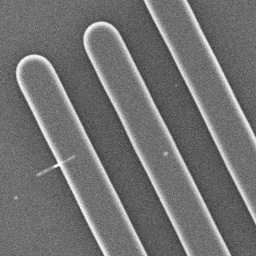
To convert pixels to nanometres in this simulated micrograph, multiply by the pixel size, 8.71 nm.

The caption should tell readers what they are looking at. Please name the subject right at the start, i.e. groups of lines, slits or small figures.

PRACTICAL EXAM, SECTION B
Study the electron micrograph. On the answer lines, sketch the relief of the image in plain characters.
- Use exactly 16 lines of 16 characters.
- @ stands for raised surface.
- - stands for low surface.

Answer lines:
---------@@@----
------@---@@----
-----@@@--@@@---
------@@---@@---
-@@---@@@--@@@--
-@@@---@@---@@--
--@@---@@@--@@@-
--@@@---@@---@@-
---@@---@@@--@@@
---@@@---@@---@@
----@@---@@@--@@
----@@@---@@---@
-----@@---@@@--@
-----@@@---@@---
------@@---@@@--
------@@@--@@@--